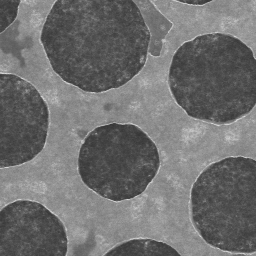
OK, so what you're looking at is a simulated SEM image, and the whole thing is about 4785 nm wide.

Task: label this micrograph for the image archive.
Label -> holes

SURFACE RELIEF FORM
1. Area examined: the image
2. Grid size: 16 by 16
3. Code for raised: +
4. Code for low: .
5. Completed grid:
.++......+++++++
.++......+++++++
+++......+++...+
+++......++.....
++++.....++.....
..+++..++++.....
...++++++++.....
...++++++++++..+
...+++...+++++++
..+++.....++++++
+++++.....+++...
+++++....+++....
+++++++.++++....
...+++++++++....
....++++++++....
....+++....+++..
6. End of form